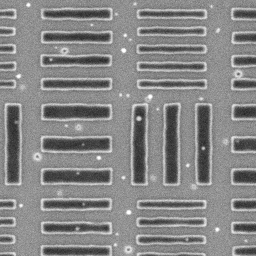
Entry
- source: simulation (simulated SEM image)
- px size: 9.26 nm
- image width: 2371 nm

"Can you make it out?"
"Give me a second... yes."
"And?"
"groups of lines, slits or small figures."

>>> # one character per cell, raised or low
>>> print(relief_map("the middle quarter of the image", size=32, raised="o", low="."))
o...ooooo.........oooooooooooooo
...................ooooooooooooo
................................
................................
oooooooooooo.......ooooooooooooo
oooooooooooo.......ooooooooooooo
................................
................................
................................
................................
oooooooooooo.....oooo....oooo...
oooooooooooo.....oooo....oooo...
oooooooooooo.....oooo....oooo...
oooooooooooo.....oooo....oooo...
.................oooo....oooo...
.................oooo....oooo...
.................oooo....oooo...
.................oooo....oooo...
oooooooooooo.....ooo.....oooo...
oooooooooooo.....oooo....oooo...
oooooooooooo.....oooo....oooo...
oooooooooooo.....oooo....oooo...
.................oooo....oooo...
.................oooo....oooo...
.................oooo....oooo...
.................oooo....oooo...
oooooooooooo.....oooo....oooo...
oooooooooooo.....oooo....oooo...
oooooooooooo.....oooo....oooo...
oooooooooooo.....oooo....oooo...
................................
................................